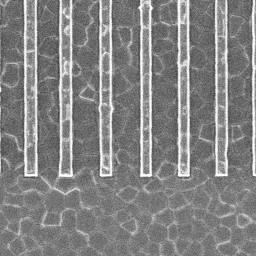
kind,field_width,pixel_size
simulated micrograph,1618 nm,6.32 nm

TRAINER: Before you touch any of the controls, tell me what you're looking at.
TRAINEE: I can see parallel lines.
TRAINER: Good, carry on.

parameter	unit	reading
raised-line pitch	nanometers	241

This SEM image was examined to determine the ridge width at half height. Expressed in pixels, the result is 11.1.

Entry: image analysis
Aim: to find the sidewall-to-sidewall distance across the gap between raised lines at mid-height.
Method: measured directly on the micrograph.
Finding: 174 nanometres